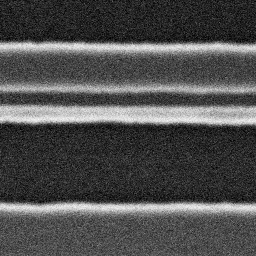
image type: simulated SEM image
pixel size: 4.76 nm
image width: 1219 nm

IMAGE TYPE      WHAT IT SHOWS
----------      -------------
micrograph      lines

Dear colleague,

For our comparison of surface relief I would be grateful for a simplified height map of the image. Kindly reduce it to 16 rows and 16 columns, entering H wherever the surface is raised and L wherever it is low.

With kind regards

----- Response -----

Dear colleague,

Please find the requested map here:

LLLLLLLLLLLLLLLL
LLLLLLLLLLLLLLLL
LLLLLLLLLLLLLLLL
HHHHHHHHHHHHHHHH
HHHHHHHHHHHHHHHH
HHHHHHHHHHHHHHHH
HHHHHHHHHHHHHHHH
HHHHHHHHHHHHHHHH
LLLLLLLLLLLLLLLL
LLLLLLLLLLLLLLLL
LLLLLLLLLLLLLLLL
LLLLLLLLLLLLLLLL
LLLLLLLLLLLLLLLL
HHHHHHHHHHHHHHHH
HHHHHHHHHHHHHHHH
HHHHHHHHHHHHHHHH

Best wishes